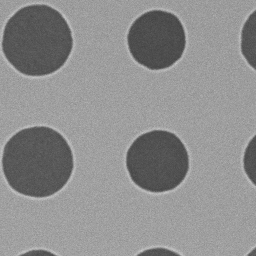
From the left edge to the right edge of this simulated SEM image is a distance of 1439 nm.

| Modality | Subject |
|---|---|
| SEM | holes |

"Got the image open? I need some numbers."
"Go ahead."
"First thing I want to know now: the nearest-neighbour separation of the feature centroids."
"675 nm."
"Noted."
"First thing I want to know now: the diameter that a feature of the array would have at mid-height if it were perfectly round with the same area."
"66.9 pixels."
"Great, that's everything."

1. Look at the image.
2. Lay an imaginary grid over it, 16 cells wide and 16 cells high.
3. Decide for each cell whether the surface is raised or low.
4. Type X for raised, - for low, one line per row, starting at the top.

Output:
X--XXXXXXXXXXXXX
----XXXX---XXXX-
----XXXX----XXX-
----XXXX---XXXX-
X--XXXXXXXXXXXXX
XXXXXXXXXXXXXXXX
XXXXXXXXXXXXXXXX
XXXXXXXXXXXXXXXX
X---XXXXX--XXXXX
----XXXX----XXX-
-----XXX----XXX-
X---XXXXX--XXXXX
XXXXXXXXXXXXXXXX
XXXXXXXXXXXXXXXX
XXXXXXXXXXXXXXXX
XXXXXXXXXXXXXXXX